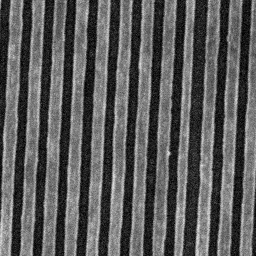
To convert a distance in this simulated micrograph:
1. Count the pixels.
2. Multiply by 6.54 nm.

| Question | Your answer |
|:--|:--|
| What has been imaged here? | parallel lines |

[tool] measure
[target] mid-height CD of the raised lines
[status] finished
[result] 69 nm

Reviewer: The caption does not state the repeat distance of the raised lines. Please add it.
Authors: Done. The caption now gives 143 nm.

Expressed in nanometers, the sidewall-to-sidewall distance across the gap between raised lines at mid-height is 74.3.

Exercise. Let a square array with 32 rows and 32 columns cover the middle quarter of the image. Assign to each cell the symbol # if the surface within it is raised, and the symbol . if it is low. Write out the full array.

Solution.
..###...###..###...###...##...##
..###...###..###...###...##...##
..###...###..###...###...##...##
...##...##...###...##...###...##
..###...##...###...##...###...##
..###...##...###...##...###...##
..###...###..###...###..###...##
..###...###..###...###..###...##
..###...##...###...##...###...#.
..##....##...###...##...###...#.
..###..###...###...##...###..##.
..###...##...###...##...###..##.
..###...##...###...##...###..##.
..##...###...##...###...##...##.
..##...###...##...###...##...##.
..##...###...##...###...##...##.
..##...###...###..###...##...##.
..##...###...###..###...##...##.
..##...###...##...###...##...##.
..##...###...##...###...##...##.
.###...###..###...###..###...##.
.###...###..###...###..###...##.
.###...###..###...###...##...##.
.###...###...##...##....##...##.
.###...##....##...##....##...##.
.###...##...###...##...###...##.
.###...##...###...##...###...##.
.###...##...###...##...###...##.
.###...##....##...##...###...##.
.###...##....##...##...###...#..
.###...##...###...##...###...#..
.###...##...###...##...###...#..